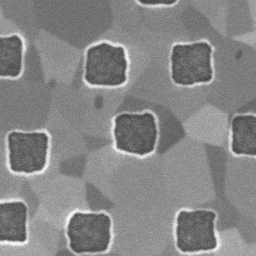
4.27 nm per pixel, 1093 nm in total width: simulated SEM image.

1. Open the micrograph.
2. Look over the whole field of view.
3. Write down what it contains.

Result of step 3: holes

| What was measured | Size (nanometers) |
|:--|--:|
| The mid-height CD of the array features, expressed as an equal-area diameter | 192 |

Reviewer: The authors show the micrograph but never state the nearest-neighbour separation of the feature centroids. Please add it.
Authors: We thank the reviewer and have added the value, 0.399 micrometres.